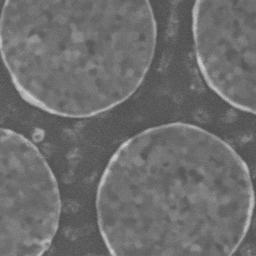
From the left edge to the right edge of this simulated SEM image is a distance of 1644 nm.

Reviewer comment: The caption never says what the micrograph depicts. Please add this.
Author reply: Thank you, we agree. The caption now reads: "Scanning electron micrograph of raised bodies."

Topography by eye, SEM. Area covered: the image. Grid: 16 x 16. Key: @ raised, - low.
@@@@@@@@@---@@@@
@@@@@@@@@@--@@@@
@@@@@@@@@@--@@@@
@@@@@@@@@@--@@@@
-@@@@@@@@----@@@
-@@@@@@@@----@@@
--@@@@@--------@
----------------
@--------@@@@---
@@-----@@@@@@@@-
@@@----@@@@@@@@-
@@@@--@@@@@@@@@@
@@@@--@@@@@@@@@@
@@@@--@@@@@@@@@@
@@@---@@@@@@@@@-
@@@----@@@@@@@@-